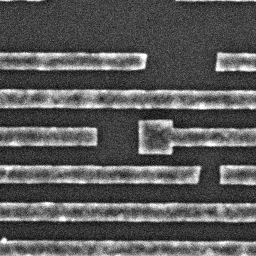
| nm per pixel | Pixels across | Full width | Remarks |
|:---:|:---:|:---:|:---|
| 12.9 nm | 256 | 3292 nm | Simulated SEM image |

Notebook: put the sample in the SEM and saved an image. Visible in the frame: wiring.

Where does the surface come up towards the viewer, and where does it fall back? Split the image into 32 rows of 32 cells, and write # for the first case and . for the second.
................................
................................
................................
................................
................................
................................
................................
##################.........#####
##################.........#####
................................
................................
################################
################################
.........................#......
................................
.................#####..........
############.....###############
############.....###############
.................#####..........
................................
................................
#########################...####
#########################...####
................................
................................
############.........##.........
################################
......##########################
................................
................................
################################
################################